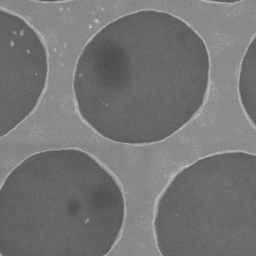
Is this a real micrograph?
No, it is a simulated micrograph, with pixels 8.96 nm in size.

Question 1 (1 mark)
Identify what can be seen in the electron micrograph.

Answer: holes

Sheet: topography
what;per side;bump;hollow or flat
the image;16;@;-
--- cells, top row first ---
@@@@@@@@@@@@@@@@
--@@@@@-----@@@@
---@@@-------@@@
---@@--------@@-
---@@--------@@-
---@@--------@@-
--@@@--------@@-
-@@@@-------@@@@
@@@@@@-----@@@@@
@@@--@@@@@@@@@-@
@------@@@@@----
-------@@@@-----
--------@@------
--------@@------
--------@@------
-------@@@------